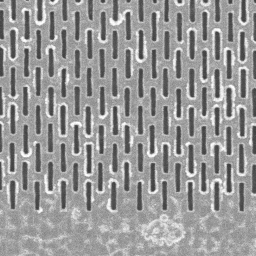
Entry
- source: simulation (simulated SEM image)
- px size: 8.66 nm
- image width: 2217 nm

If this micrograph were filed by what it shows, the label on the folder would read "a regular array of holes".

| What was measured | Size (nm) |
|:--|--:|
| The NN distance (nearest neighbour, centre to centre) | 189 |